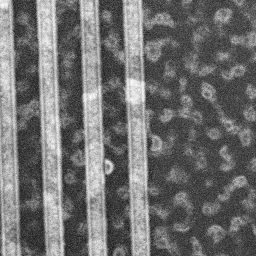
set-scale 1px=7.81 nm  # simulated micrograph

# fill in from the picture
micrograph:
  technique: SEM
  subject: parallel lines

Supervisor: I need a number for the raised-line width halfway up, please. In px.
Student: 14.4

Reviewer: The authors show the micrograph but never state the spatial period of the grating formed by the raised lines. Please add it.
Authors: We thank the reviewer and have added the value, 337 nm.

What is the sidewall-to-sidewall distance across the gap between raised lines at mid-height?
224 nanometres